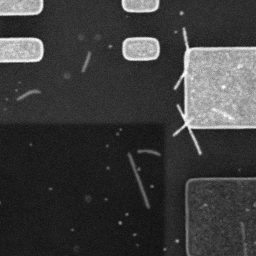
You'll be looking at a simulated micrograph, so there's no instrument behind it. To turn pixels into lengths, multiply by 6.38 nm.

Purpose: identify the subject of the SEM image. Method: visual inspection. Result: wiring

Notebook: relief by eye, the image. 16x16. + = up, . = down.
+++.....++......
................
++......++......
+++.....++..++++
............++++
............++++
............++++
............++++
................
................
................
............++++
............++++
............++++
............++++
............++++